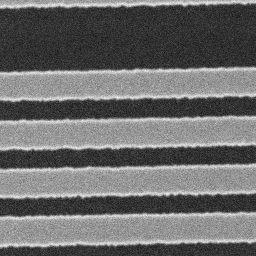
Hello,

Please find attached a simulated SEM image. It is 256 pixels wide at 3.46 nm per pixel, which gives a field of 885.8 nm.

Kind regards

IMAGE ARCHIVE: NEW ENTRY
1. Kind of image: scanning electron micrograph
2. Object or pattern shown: lines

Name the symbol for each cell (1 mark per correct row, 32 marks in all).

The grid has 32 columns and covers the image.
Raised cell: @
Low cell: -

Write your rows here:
@@@@@@@@@@@@@@@@@@@@@@@@@@@@@---
--------------------------------
--------------------------------
--------------------------------
--------------------------------
--------------------------------
--------------------------------
--------------------------------
--------------------------------
@@@@@@@@@@@@@@@@@@@@@@@@@@@@@@@@
@@@@@@@@@@@@@@@@@@@@@@@@@@@@@@@@
@@@@@@@@@@@@@@@@@@@@@@@@@@@@@@@@
@@--@@@-------------------------
--------------------------------
--------------------------------
@@@@@@@@@@@@@@@@@@@@@@@@@@@@@@@@
@@@@@@@@@@@@@@@@@@@@@@@@@@@@@@@@
@@@@@@@@@@@@@@@@@@@@@@@@@@@@@@@@
@@@@@@@@-@@-@-@-----------------
--------------------------------
--------------------------------
@@@@@@@@@@@@@@@@@@@@@@@@@@@@@@@@
@@@@@@@@@@@@@@@@@@@@@@@@@@@@@@@@
@@@@@@@@@@@@@@@@@@@@@@@@@@@@@@@@
@@@@@@@@@@@@@--@----------------
--------------------------------
--------------------------------
@@@@@@@@@@@@@@@@@@@@@@@@@@@@@@@@
@@@@@@@@@@@@@@@@@@@@@@@@@@@@@@@@
@@@@@@@@@@@@@@@@@@@@@@@@@@@@@@@@
@@@@@@@@@@@@@@@@@-@-------------
--------------------------------